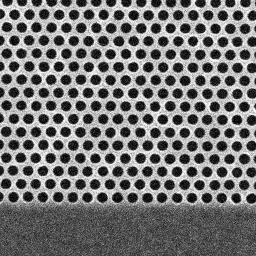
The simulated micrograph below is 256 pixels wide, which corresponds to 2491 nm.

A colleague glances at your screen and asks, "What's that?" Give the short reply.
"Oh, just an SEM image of a regular array of holes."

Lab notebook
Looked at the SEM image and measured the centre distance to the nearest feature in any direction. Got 142 nm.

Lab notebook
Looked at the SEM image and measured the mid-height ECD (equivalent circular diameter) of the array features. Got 11.2 px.